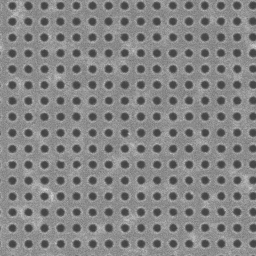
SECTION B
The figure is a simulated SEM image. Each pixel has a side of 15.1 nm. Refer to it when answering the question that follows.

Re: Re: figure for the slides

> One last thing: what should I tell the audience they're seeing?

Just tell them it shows a regular array of holes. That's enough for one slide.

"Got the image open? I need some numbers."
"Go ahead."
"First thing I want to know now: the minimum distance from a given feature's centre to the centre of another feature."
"234 nanometres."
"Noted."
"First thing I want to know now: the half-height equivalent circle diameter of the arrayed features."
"126 nm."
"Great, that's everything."